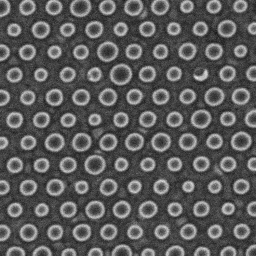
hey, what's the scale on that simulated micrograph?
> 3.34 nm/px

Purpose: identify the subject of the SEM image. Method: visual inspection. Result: a regular array of raised bodies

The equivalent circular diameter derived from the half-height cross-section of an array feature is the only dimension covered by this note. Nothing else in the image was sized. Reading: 49.7 nm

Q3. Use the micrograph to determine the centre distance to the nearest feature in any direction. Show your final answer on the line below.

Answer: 86.5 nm